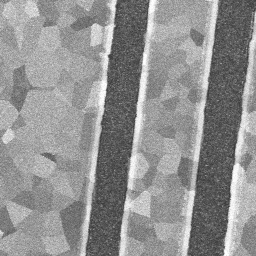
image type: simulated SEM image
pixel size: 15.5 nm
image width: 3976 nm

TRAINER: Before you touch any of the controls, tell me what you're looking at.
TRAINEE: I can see one or a few lines or trenches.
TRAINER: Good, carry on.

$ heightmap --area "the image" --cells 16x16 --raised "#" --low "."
#######...###...
#######..####...
#######..####...
#######..####...
#######..####...
######...####..#
######...####..#
######...####..#
######...###...#
######..####...#
######..####...#
######..####...#
######..####...#
#####...####..##
#####...####..##
#####...####..##